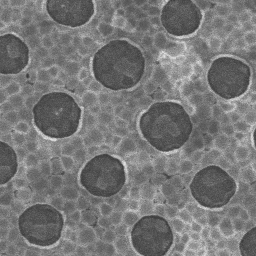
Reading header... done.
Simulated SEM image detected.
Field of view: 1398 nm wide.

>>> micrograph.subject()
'holes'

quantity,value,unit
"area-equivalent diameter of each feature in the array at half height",236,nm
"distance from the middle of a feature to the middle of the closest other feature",0.419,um